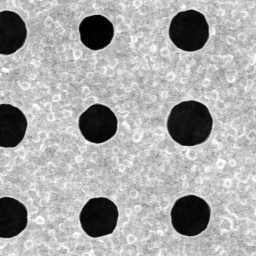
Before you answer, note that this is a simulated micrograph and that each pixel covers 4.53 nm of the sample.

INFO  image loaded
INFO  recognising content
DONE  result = holes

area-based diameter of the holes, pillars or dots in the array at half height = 182 nanometers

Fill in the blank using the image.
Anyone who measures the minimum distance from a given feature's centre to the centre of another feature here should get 414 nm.